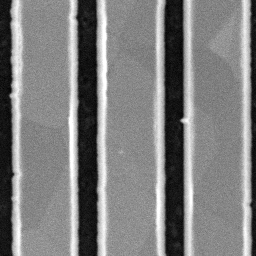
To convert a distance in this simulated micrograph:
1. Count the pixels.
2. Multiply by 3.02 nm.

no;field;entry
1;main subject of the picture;one or a few lines or trenches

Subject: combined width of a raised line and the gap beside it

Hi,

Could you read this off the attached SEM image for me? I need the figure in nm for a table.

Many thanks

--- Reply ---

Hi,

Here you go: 260